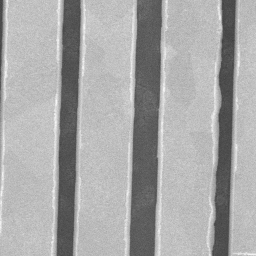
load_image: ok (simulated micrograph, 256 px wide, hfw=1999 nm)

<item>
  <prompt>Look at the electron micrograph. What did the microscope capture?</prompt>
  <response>one or a few lines or trenches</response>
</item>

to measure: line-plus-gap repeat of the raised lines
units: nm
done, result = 629